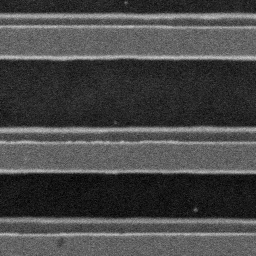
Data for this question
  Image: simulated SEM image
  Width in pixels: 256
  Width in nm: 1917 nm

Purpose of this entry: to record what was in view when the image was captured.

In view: lines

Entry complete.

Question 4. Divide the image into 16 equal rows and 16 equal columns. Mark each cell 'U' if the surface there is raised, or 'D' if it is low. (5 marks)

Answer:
DDDDDDDDDDDDDDDD
UUUUUUUUUUUUUUUU
UUUUUUUUUUUUUUUU
UUUUUUUUUUUUUUUU
DDDDDDDDDDDDDDDD
DDDDDDDDDDDDDDDD
DDDDDDDDDDDDDDDD
DDDDDDDDDDDDDDDD
UUUUUUUUUUUUUUUU
UUUUUUUUUUUUUUUU
UUUUUUUUUUUUUUUU
DDDDDDDDDDDDDDDD
DDDDDDDDDDDDDDDD
DDDDDDDDDDDDDDDD
UUUUUUUUUUUUUUUU
UUUUUUUUUUUUUUUU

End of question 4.